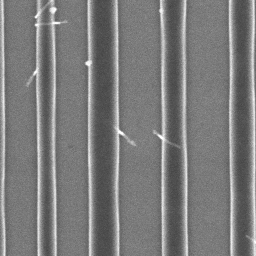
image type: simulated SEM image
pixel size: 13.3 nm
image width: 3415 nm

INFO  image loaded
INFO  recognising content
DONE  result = groups of lines, slits or small figures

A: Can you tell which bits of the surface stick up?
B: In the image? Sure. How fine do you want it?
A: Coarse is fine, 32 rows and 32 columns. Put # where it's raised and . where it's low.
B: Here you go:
.....##....####.....###......###
.....##....####.....###......###
.....##....####.....###......###
.....##....####.....###......###
.....##....####.....###......###
.....##....####.....###......###
.....##....####.....###......###
.....##....####.....###......###
.....##....####.....###......###
.....##....####.....###......###
.....##....####.....###......###
.....##....####.....###......###
.....##....####.....###......###
.....##....####.....###......###
#....##....####.....###......###
#....##....####.....###......###
#....##....####.....###......###
#....##....####.....###......###
#....##....####.....###......###
#....##....####.....###......###
.....##....####.....###......###
.....##....####.....###......###
.....##....####.....###......###
.....##....####.....###......###
.....##....####.....###......###
.....##....####.....###......###
.....##....####.....###......###
.....##....####.....###......###
#....##....####.....###......###
#....##....####.....###......###
#....##....####.....###......###
#....##....####.....###......###